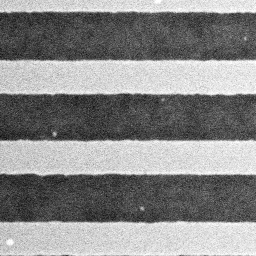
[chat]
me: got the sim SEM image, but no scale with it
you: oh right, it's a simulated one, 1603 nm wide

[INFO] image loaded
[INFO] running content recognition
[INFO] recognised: lines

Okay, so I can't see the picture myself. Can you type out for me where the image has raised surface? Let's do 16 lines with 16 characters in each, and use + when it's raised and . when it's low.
++++++++++++++++
................
................
................
++++++++++++++++
++++++++++++++++
................
................
................
++++++++++++++++
++++++++++++++++
................
................
................
++++++++++++++++
++++++++++++++++